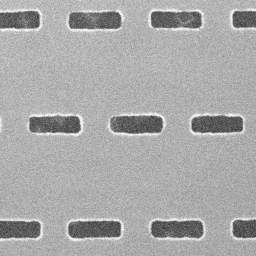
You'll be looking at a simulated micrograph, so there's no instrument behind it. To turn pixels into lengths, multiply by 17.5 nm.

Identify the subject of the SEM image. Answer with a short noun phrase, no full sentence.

holes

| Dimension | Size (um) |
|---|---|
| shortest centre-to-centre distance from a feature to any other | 1.42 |